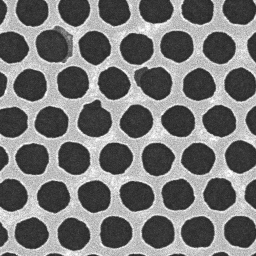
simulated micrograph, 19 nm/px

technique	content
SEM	a regular array of holes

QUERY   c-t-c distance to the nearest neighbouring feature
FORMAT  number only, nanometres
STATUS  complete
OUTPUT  780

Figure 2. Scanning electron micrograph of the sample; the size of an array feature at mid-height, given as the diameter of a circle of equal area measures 33.2 pixels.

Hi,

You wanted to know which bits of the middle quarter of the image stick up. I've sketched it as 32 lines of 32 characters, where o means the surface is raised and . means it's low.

oo.ooooooooooooooooooooooooooooo
.....ooooo....oooo........oooooo
......ooo.......o..........oooo.
......ooo.......o..........ooo..
......oo.........o.........ooo..
......ooo........o.........ooo..
......ooo.......ooo........ooo..
.....ooooo......oooo.......ooo..
o...ooooooo...oooooooo...oooooo.
ooooooo..ooooooooooooooooooooooo
ooooo.....oooooo....ooooooo...oo
oooo.......ooooo.....ooooo......
.ooo........ooo.......ooo.......
.oo.........oo........oo........
.oo.........oo........oo........
.oo.........oo........ooo.......
.ooo.......ooo........ooo.......
ooooo......ooooo.....ooooo......
ooooooooooooooooo.oooooooooooooo
...ooooooooooooooooooooooooooooo
.....ooooo......ooooo.....ooooo.
......ooo........ooo.......ooo..
......ooo........oo.........o...
.......oo........oo.........o...
.......oo........oo........oo...
......ooo.......oooo.......ooo..
......oooo......oooo......ooooo.
oo..oooooooo..ooooooo....ooooooo
ooooooooooooooooooooooooooooo.oo
oooooo....oooooo...ooooooo.....o
.ooo.......ooo.......oooo.......
.ooo........oo........oo........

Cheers